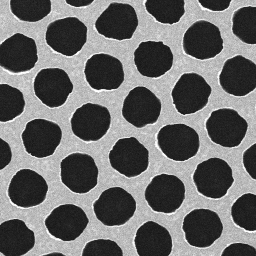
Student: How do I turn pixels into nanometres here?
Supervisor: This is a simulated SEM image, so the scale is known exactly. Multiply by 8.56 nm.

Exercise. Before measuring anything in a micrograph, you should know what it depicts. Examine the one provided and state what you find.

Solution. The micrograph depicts a regular array of holes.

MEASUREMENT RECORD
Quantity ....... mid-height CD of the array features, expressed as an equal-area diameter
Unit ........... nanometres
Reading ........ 334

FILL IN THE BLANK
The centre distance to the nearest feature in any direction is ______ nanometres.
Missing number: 433